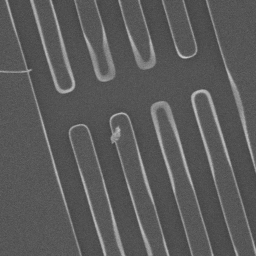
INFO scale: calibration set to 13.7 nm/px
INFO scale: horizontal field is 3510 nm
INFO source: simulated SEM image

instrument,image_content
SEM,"groups of lines, slits or small figures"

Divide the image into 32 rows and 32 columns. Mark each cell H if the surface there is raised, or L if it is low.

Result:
HLLLHHLLLHHHLLLHHHLLHHHLLLHHHHHH
HLLLHHHLLLHHLLLHHHLLLHHLLLHHHHHH
HHLLLHHLLLHHHLLLHHLLLHHHLLHHHHHH
HHLLLHHLLLHHHLLLHHLLLHHHLLLHHHHH
HHLLLHHHLLLHHLLLHHHLLLHHLLLHHHHH
HHLLLHHHLLLHHLLLLHHLLLHHHLLHHHHH
HHHLLLHHLLLHHLLLLHHLLLHHHLLLHHHH
HHHLLLHHLLLLHHLLLHHLLLLLLLLLHHHH
HHHLLLHHHLLLHHLLLLLLLLLLLLLLHHHH
HHHHLLLHHLLLHHLLLLLLLLLLLLLLLHHH
HHHHLLLHHLLLLLLLLLLLLLLLLLLLLHHH
HHHHLLLLLLLLLLLLLLLLLLLLLHLLLHHH
HHHHHLLLLLLLLLLLLLLLLLLLHHLLLLHH
HHHHHLLLLLLLLLLLLLLHHLLLHHHLLLHH
HHHHHLLLLLLLLLHHLLLHHLLLLHHLLLHH
HHHHHLLLLLLLLLHHLLLHHHLLLHHLLLLH
HHHHHHLLLHHLLLHHHLLLHHLLLHHHLLLH
HHHHHHLLLHHLLLHHHLLLHHLLLHHHLLLH
HHHHHHLLLHHHLLLHHLLLHHHLLLHHLLLH
HHHHHHLLLHHHLLLHHLLLLHHLLLHHLLLH
HHHHHHHLLLHHLLLHHHLLLHHLLLHHHLLL
HHHHHHHLLLHHHLLHHHLLLHHLLLLHHLLL
HHHHHHHLLLHHHLLLHHLLLHHHLLLHHLLL
HHHHHHHHLLLHHLLLHHHLLLHHLLLHHHLL
HHHHHHHHLLLHHLLLHHHLLLHHHLLHHHLL
HHHHHHHHLLLHHHLLLHHLLLHHHLLLHHLL
HHHHHHHHHLLHHHLLLHHHLLHHHLLLHHHL
HHHHHHHHHLLLHHLLLHHHLLLHHLLLHHHL
HHHHHHHHHLLLHHLLLLHHLLLHHHLLHHHL
HHHHHHHHHLLLHHHLLLHHLLLHHHLLLHHL
HHHHHHHHHHLLLHHLLLHHHLLLHHLLLHHH
HHHHHHHHHHLLLHHLLLLHHLLLHHLLLHHH